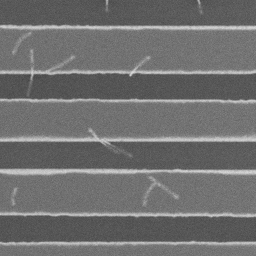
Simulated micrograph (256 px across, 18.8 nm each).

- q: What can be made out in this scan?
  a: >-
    lines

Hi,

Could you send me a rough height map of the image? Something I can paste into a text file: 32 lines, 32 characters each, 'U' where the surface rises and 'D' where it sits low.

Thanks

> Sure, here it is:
DDDDDDDDDDDDDDDDDDDDDDDDDDDDDDDD
DDDDDDDDDDDDDDDDDDDDDDDDDDDDDDDD
DDDDDDDDDDDDDDDDDDDDDDDDDDDDDDDD
UUUUUUUUUUUUUUUUUUUUUUUUUUUUUUUU
UUUUUUUUUUUUUUUUUUUUUUUUUUUUUUUU
UUUUUUUUUUUUUUUUUUUUUUUUUUUUUUUU
UUUUUUUUUUUUUUUUUUUUUUUUUUUUUUUU
UUUUUUUUUUUUUUUUUUUUUUUUUUUUUUUU
UUUUUUUUUUUUUUUUUUUUUUUUUUUUUUUU
DDDDDDDDDDDDDDDDDDDDDDDDDDDDDDDD
DDDDDDDDDDDDDDDDDDDDDDDDDDDDDDDD
DDDDDDDDDDDDDDDDDDDDDDDDDDDDDDDD
UUUUDDUUDUUUUDDDUUDDDDDDDDDDDDDD
UUUUUUUUUUUUUUUUUUUUUUUUUUUUUUUU
UUUUUUUUUUUUUUUUUUUUUUUUUUUUUUUU
UUUUUUUUUUUUUUUUUUUUUUUUUUUUUUUU
UUUUUUUUUUUUUUUUUUUUUUUUUUUUUUUU
UUUUUUUUUUUUUUUUUUUUUUUUUUUUUUUU
DDDDDDDDDDDDDDDDDDDDDDDDDDDDDDDD
DDDDDDDDDDDDDDDDDDDDDDDDDDDDDDDD
DDDDDDDDDDDDDDDDDDDDDDDDDDDDDDDD
UUUUUUUUUUUUUUUUUUUUUUUUUUUUUUDU
UUUUUUUUUUUUUUUUUUUUUUUUUUUUUUUU
UUUUUUUUUUUUUUUUUUUUUUUUUUUUUUUU
UUUUUUUUUUUUUUUUUUUUUUUUUUUUUUUU
UUUUUUUUUUUUUUUUUUUUUUUUUUUUUUUU
UUUUUUUUUUUUUUUUUUUUUUUUUUUUUUUU
DDDDDDDDDDDDDDDDDDDDDDDDDDDDDDDD
DDDDDDDDDDDDDDDDDDDDDDDDDDDDDDDD
DDDDDDDDDDDDDDDDDDDDDDDDDDDDDDDD
UUUUUUUUUUUUUUUUUUUUUUUUUUUUUUUU
UUUUUUUUUUUUUUUUUUUUUUUUUUUUUUUU